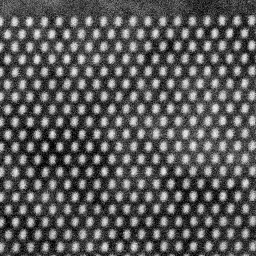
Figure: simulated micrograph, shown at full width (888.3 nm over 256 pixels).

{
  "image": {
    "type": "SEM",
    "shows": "a regular array of raised bodies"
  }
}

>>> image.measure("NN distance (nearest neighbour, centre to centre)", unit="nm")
49.7